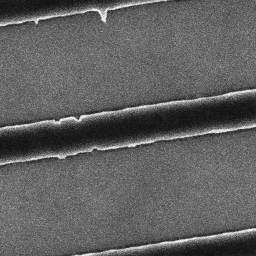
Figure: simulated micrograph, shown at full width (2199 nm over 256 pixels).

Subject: one or a few lines or trenches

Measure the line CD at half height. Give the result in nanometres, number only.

313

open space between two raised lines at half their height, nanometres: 871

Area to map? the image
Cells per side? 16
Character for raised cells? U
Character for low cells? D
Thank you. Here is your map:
UUUUUUUDDDDDDDDD
UDDDDDDDDDDDDDDD
DDDDDDDDDDDDDDDD
DDDDDDDDDDDDDDDD
DDDDDDDDDDDDDDDD
DDDDDDDDDDDDDDDD
DDDDDDDDDDUUUUUU
DDDDUUUUUUUUUUUU
UUUUUUUUUUUUDDDD
UUUUUDDDDDDDDDDD
DDDDDDDDDDDDDDDD
DDDDDDDDDDDDDDDD
DDDDDDDDDDDDDDDD
DDDDDDDDDDDDDDDD
DDDDDDDDDDDDDDDU
DDDDDDDDUUUUUUUU